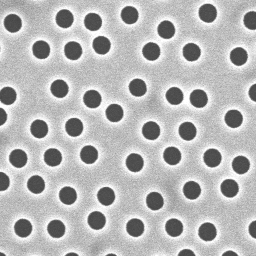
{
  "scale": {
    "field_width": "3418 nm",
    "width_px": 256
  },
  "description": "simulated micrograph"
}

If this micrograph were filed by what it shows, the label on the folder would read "a regular array of holes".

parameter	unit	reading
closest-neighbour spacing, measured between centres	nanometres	420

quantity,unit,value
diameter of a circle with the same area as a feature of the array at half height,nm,253